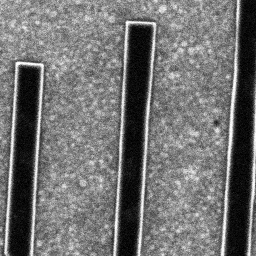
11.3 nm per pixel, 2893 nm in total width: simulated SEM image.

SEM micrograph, one or a few lines or trenches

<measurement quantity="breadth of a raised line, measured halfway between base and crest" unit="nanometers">305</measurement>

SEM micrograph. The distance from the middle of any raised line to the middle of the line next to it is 1.23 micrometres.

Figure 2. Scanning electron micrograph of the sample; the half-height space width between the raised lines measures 936 nm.